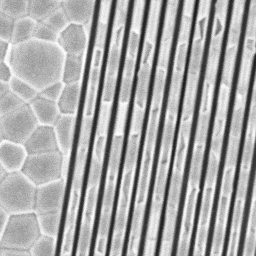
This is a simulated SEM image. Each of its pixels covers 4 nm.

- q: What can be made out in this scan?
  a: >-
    parallel lines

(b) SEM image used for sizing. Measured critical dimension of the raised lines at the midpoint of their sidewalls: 46.9 nm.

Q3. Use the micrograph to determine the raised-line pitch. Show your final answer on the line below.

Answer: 65.7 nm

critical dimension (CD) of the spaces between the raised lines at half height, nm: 20.2